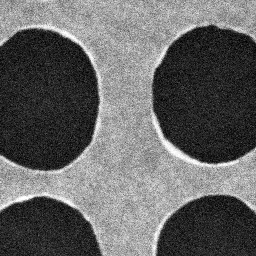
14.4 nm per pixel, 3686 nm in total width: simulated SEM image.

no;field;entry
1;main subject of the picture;holes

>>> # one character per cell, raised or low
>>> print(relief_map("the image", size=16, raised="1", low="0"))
1111111111111111
1111111111111111
0000011111100000
0000001111000000
0000001111000000
0000001110000000
0000001111000000
0000001111000000
0000001111000000
0000011111100000
1100111111111111
1111111111111111
1000111111110001
0000011111100000
0000001111000000
0000001111000000